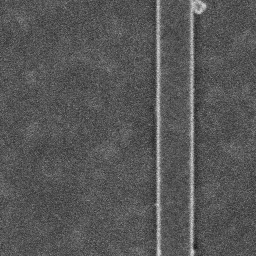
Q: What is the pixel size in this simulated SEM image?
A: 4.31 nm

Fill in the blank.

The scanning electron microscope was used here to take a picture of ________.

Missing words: one or a few lines or trenches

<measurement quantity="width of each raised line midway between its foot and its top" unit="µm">0.148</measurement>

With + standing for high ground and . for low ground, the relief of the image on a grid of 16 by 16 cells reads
..........++....
..........++....
..........++....
..........++....
..........++....
..........++....
..........++....
..........++....
..........++....
..........++....
..........++....
..........++....
..........++....
..........++....
..........++....
..........++....